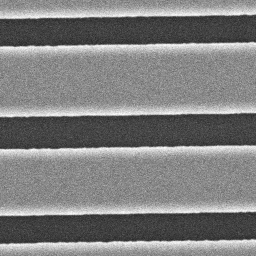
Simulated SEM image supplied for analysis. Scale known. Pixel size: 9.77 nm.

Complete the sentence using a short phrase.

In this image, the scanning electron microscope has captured lines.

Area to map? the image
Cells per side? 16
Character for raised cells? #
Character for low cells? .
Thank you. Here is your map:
################
................
................
################
################
################
################
................
................
################
################
################
################
................
................
################